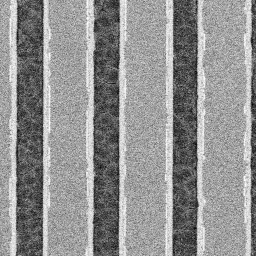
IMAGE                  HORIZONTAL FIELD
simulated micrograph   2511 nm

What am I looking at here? one or a few lines or trenches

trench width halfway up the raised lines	294	nm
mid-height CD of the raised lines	0.478	µm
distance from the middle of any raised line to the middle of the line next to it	766	nanometres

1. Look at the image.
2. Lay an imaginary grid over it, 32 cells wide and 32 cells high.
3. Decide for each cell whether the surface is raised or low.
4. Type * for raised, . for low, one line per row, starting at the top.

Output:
**....*****....******....******.
**....*****....******....******.
**....******...******....******.
**....*****....******....******.
**....*****....******....******.
**....*****....******....******.
**....*****....******....******.
**....*****....******....******.
**....*****....******....******.
**....*****....******....******.
**....*****....******....******.
**....*****....******....******.
**....*****....******....******.
**....*****....******....******.
**....*****....******....******.
**....*****....******....******.
**....*****....******....******.
**....*****....******....******.
**....*****....******....******.
**....*****....******....******.
**....*****....******....******.
**....*****....******....******.
**....*****....******....******.
**....*****....******....******.
**....*****....******....******.
**....*****....******....******.
**....*****....******....******.
**....*****....******....******.
**....*****....******....******.
**....*****....******....******.
**....*****....******....******.
**....*****....******....******.